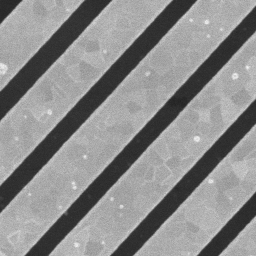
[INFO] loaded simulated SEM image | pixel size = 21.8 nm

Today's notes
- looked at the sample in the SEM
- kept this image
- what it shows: lines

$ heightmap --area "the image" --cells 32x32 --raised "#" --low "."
..########....#######...########
.########....#######...########.
.#######....#######...########..
#######....#######...########...
######....#######....#######...#
######...#######....########...#
#####...########...########...##
####...########...########...###
###...########...########...####
##...########...########...#####
#...########...########...######
...########...########...#######
..########...########...########
..#######...########...########.
.#######...########...########..
#######...########...########...
######...########...########...#
#####...########...########...##
####....#######...########...###
###....########...#######...####
###...########...#######...#####
##...########...#######...######
#...########...#######....######
...########...########...#######
..########...########...#######.
.########...########...########.
########...########...########..
#######...########...########...
######...########...########...#
#####...########...########...##
####...########...########...###
###...########...########...####